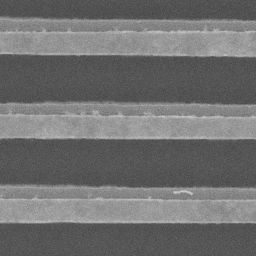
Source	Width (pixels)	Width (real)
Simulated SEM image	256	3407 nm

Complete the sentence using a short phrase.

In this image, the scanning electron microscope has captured lines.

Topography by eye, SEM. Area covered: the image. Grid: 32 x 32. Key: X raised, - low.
--------------------------------
--------------------------------
XXXXXXX--X----------------------
XXXXXXXXXXXXXXXXXXXXXXXXXXXXXXXX
XXXXXXXXXXXXXXXXXXXXXXXXXXXXXXXX
XXXXXXXXXXXXXXXXXXXXXXXXXXXXXXXX
XXXXXXXXXXXXXXXXXXXXXXXXXXXXXXXX
--------------------------------
--------------------------------
--------------------------------
--------------------------------
--------------------------------
--------------------------------
XXXXXXXXXXXXXXXXXXXXXXXXXXXXXXXX
XXXXXXXXXXXXXXXXXXXXXXXXXXXXXXXX
XXXXXXXXXXXXXXXXXXXXXXXXXXXXXXXX
XXXXXXXXXXXXXXXXXXXXXXXXXXXXXXXX
--------------------------------
--------------------------------
--------------------------------
--------------------------------
--------------------------------
--------------------------------
XXXXXXXXXXXXXXXX----X-----------
XXXXXXXXXXXXXXXXXXXXXXXXXXXXXXXX
XXXXXXXXXXXXXXXXXXXXXXXXXXXXXXXX
XXXXXXXXXXXXXXXXXXXXXXXXXXXXXXXX
XXXXXXXXXXXXXXXXXXXXXXXXXXXXXXXX
--------------------------------
--------------------------------
--------------------------------
--------------------------------